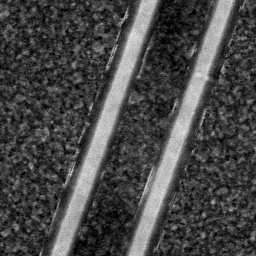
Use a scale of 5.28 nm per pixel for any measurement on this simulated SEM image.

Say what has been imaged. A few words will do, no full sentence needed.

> one or a few lines or trenches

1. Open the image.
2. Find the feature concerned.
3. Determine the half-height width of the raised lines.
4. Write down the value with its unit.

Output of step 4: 389 nm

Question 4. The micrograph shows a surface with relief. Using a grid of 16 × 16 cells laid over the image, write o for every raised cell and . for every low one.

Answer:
.........ooooo..
.........ooooo..
........ooooo...
........ooooo...
........ooooo...
.......ooooo....
.......ooooo....
.......ooooo....
......ooooo.....
......ooooo.....
......ooooo.....
.....ooooo......
.....ooooo......
.....oooo.......
....ooooo.......
....ooooo.......